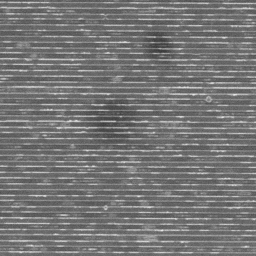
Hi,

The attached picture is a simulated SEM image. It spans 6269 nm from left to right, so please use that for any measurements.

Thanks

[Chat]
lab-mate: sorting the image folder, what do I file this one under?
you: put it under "parallel lines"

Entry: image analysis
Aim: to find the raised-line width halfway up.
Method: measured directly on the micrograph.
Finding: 144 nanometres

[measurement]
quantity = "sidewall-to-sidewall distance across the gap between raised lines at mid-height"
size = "0.126 microns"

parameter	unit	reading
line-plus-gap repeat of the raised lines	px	11.4